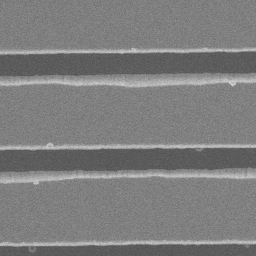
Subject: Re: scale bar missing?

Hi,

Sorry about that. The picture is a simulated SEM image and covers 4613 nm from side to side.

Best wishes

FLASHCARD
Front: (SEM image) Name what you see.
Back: lines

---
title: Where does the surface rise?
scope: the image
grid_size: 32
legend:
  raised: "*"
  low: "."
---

********************************
********************************
********************************
********************************
********************************
********************************
*******************...**........
................................
................................
................................
********************************
********************************
********************************
********************************
********************************
********************************
********************************
********************************
************************........
................................
................................
................................
********************************
********************************
********************************
********************************
********************************
********************************
********************************
********************************
*****************.**............
................................